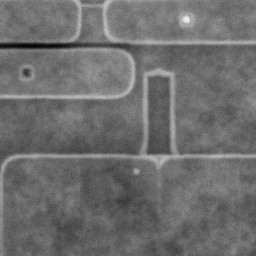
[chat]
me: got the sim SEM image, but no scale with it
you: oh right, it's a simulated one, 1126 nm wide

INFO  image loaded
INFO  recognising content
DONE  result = wiring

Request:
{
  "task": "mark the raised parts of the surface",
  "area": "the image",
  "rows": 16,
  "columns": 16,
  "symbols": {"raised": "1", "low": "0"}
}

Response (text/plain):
1111100111111111
1111100111111111
1111100111111111
1111111100000000
1111111100000000
1111111100000000
0000000000000000
0000000000000000
0000000000000000
0000000000000000
1111111111111111
1111111111111111
1111111111111111
1111111111111111
1111111111111111
1111111111111111